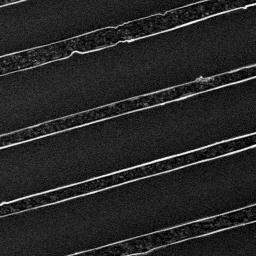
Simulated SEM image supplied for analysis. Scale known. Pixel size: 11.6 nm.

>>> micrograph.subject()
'one or a few lines or trenches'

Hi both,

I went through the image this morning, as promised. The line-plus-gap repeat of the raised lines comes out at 803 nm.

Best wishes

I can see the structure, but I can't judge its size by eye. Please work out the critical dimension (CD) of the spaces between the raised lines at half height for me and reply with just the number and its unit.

638 nm